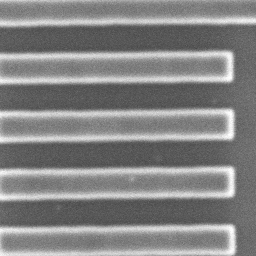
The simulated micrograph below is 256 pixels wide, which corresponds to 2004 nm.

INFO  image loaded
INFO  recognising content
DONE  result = groups of lines, slits or small figures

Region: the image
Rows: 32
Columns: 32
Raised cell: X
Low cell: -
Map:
XXXXXXXXXXXXXXXXXXXXXXXXXXXXXXXX
XXXXXXXXXXXXXXXXXXXXXXXXXXXXXXXX
XXXXXXXXXXXXXXXXXXXXXXXXXXXXXXXX
--------------------------------
--------------------------------
--------------------------------
--------------------------------
XXXXXXXXXXXXXXXXXXXXXXXXXXXXX---
XXXXXXXXXXXXXXXXXXXXXXXXXXXXX---
XXXXXXXXXXXXXXXXXXXXXXXXXXXXX---
--------------------------------
--------------------------------
--------------------------------
--------------------------------
XXXXXXXXXXXXXXXXXXXXXXXXXXXXX---
XXXXXXXXXXXXXXXXXXXXXXXXXXXXX---
XXXXXXXXXXXXXXXXXXXXXXXXXXXXX---
--------------------------------
--------------------------------
--------------------------------
--------------------------------
XXXXXXXXXXXXXXXXXXXXXXXXXXXXX---
XXXXXXXXXXXXXXXXXXXXXXXXXXXXX---
XXXXXXXXXXXXXXXXXXXXXXXXXXXXX---
XXXXXXXXXXXXXXXXXX--------------
--------------------------------
--------------------------------
--------------------------------
-------------------XXXXXXXXXX---
XXXXXXXXXXXXXXXXXXXXXXXXXXXXX---
XXXXXXXXXXXXXXXXXXXXXXXXXXXXX---
XXXXXXXXXXXXXXXXXXXXXXXXXXXXX---